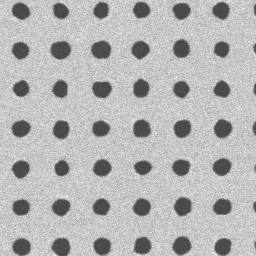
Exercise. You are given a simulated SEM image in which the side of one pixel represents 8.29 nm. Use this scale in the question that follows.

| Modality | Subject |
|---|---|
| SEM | a regular array of holes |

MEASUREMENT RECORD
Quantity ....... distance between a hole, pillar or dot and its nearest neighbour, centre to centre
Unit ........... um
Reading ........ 0.322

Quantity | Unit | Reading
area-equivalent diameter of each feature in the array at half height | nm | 144